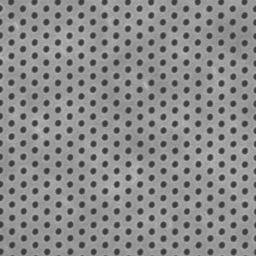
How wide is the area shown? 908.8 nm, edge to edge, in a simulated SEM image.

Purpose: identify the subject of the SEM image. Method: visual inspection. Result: a regular array of holes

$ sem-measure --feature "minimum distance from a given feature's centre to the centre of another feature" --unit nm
47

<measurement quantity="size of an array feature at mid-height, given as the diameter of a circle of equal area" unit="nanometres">21.6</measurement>